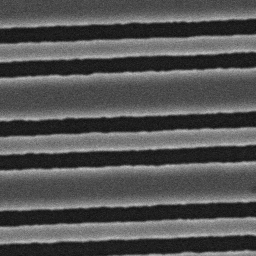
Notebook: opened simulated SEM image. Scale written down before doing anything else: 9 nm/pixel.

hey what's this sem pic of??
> lines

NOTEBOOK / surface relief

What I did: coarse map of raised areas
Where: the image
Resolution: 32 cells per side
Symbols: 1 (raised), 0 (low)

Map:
11111111111111111111111111111111
11111111111111111111111111111111
11111111111111111111111111000000
00000000000000000000000000000000
00000000000000000000000000000111
00111111111111111111111111111111
11111111111111111111111111111111
11100000000000000000000000000000
00000000000000000000000000000001
00000011111111111111111111111111
11111111111111111111111111111111
11111111111111111111111111111111
11111111111111111111111111111111
11111111111111111111111111111111
11111111111111111100000000000000
00000000000000000000000000000000
00000000000000000111111111111111
11111111111111111111111111111111
11111111111111111111111000000000
00000000000000000000000000000000
00000000000000000000000000111111
11111111111111111111111111111111
11111111111111111111111111111111
11111111111111111111111111111111
11111111111111111111111111111111
11111111111111111111000000000000
00000000000000000000000000000000
00000000000000000000001111111111
11111111111111111111111111111111
11111111111111111111111111110000
00000000000000000000000000000000
00000000000000000000000000001111